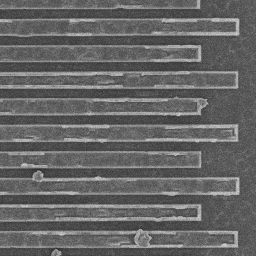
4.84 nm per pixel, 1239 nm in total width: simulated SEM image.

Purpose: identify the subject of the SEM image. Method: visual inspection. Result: parallel lines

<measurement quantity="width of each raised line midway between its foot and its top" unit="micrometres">0.0787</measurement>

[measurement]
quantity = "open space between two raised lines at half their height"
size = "10.8 px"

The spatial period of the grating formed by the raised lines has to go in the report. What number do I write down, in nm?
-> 128